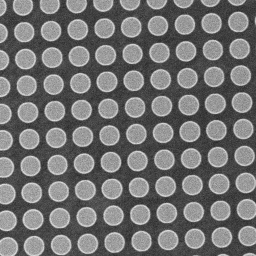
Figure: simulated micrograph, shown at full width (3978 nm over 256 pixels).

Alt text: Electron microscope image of an array of small figures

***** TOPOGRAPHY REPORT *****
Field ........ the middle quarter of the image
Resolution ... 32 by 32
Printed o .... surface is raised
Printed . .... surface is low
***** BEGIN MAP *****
...o............................
.......................oo....ooo
...oo....ooo....ooo...oooo...ooo
..oooo..ooooo..ooooo..ooooo.oooo
..oooo..ooooo..ooooo..ooooo.oooo
..ooooo.ooooo..oooo...oooo...ooo
..oooo...ooo.....o..............
................................
..................o....ooo...ooo
...ooo...oooo...oooo..ooooo..ooo
..ooooo..oooo..ooooo..ooooo..ooo
..ooooo..oooo..ooooo..ooooo..ooo
..ooooo..oooo...oooo...ooo....oo
...ooo..........................
...............................o
.................oo....ooo...ooo
...ooo...oooo...oooo..ooooo..ooo
..ooooo..ooooo..oooo..ooooo..ooo
..ooooo..ooooo..oooo...oooo...oo
...oooo...ooo....ooo....oo......
....o...........................
.........................o.....o
....oo....ooo....ooo...oooo...oo
...oooo..ooooo..ooooo..oooo..ooo
o..oooo..ooooo..ooooo..ooooo.ooo
o..oooo..ooooo..oooo...oooo...oo
...oooo...ooo....oo.............
................................
........................ooo...oo
....ooo...oooo...oooo..ooooo..oo
o..ooooo..oooo..ooooo..ooooo..oo
o..ooooo.oooooo.ooooo..ooooo..oo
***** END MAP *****